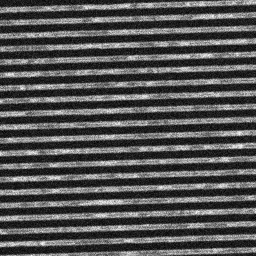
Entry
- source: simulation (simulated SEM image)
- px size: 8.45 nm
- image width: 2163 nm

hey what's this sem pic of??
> parallel lines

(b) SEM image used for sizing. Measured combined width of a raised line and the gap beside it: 0.11 micrometres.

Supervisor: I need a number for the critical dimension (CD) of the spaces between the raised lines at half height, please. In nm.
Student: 78.1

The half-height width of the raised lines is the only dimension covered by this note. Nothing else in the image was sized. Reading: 34.8 nanometres